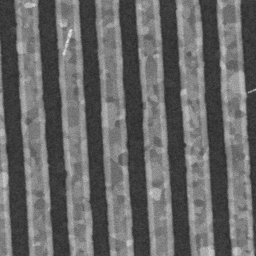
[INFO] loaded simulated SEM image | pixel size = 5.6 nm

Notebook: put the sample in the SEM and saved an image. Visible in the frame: parallel lines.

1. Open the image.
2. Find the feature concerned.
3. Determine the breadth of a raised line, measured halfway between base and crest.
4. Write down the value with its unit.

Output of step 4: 17.1 pixels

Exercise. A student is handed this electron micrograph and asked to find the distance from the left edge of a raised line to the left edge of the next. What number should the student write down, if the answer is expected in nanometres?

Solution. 226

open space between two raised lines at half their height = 23.1 px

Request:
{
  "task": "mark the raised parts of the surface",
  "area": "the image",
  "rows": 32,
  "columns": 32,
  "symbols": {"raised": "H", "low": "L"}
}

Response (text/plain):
LLHHLLLHHLLLHHLLLHHLLLHHHLLHHHLL
LLHHLLLHHLLLHHHLLHHHLLHHHLLHHHLL
LLHHLLLHHHLLHHHLLHHHLLHHHLLLHHLL
LLHHHLLHHHLLHHHLLHHHLLLHHLLLHHLL
LLHHHLLHHHLLLHHLLLHHLLLHHLLLHHLL
LLHHHLLLHHLLLHHLLLHHLLLHHLLLHHLL
LLLHHLLLHHLLLHHLLLHHLLLHHLLLHHLL
LLLHHLLLHHLLLHHLLLHHLLLHHLLLHHLL
LLLHHLLLHHLLLHHLLLHHLLLHHLLLHHLL
LLLHHLLLHHLLLHHLLLHHLLLHHLLLHHLL
LLLHHLLLHHLLLHHLLLHHLLLHHLLLHHLL
LLLHHLLLHHLLLHHLLLHHLLLHHLLLHHLL
LLLHHLLLHHLLLHHLLLHHLLLHHLLLHHLL
LLLHHLLLHHLLLHHLLLHHLLLHHLLLHHLL
LLLHHLLLHHLLLHHLLLHHLLLHHLLLHHLL
LLLHHLLLHHLLLHHLLLHHLLLHHHLLHHLL
LLLHHLLLHHLLLHHLLLHHLLLHHLLLHHHL
LLLHHLLLHHLLLHHLLLHHHLLHHHLLLHHL
LLLHHLLLHHLLLHHHLLHHHLLLHHLLLHHL
LLLHHHLLHHHLLHHHLLHHHLLLHHLLLHHL
HLLHHHLLLHHLLHHHLLLHHLLLHHLLLHHL
HLLLHHLLLHHLLLHHLLLHHLLLHHLLLHHL
HLLLHHLLLHHLLLHHLLLHHLLLHHLLLHHL
HLLLHHLLLHHLLLHHLLLHHLLLHHLLLHHL
HLLLHHLLLHHLLLHHLLLHHLLLHHLLLHHL
HLLLHHLLLHHLLLHHLLLHHLLLHHLLLHHL
HLLLHHLLLHHLLLHHLLLHHLLLHHLLLHHL
HLLLHHLLLHHLLLHHLLLHHLLLHHLLLHHL
HLLLHHLLLHHLLLHHLLLHHLLLHHLLLHHL
HLLLHHLLLHHLLLHHLLLHHLLLHHLLLHHL
HLLLHHLLLHHLLLHHLLLHHLLLHHLLLHHL
HLLLHHLLLHHLLLHHLLLHHLLLHHLLLHHL